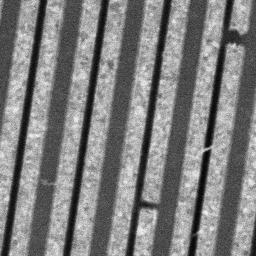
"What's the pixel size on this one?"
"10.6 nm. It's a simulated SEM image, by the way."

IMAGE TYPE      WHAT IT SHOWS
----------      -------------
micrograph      parallel lines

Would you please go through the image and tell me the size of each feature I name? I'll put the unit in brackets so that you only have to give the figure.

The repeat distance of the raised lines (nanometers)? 324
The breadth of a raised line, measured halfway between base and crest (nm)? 192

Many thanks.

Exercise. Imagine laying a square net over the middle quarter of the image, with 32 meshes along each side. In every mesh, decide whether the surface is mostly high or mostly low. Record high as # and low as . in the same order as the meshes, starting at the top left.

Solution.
...####..####.....#####.#####...
..#####..####.....####..#####...
..#####.#####.....####..#####...
..#####.#####.....####..####....
..####..#####.....####..####....
..####..####.....#####..####....
..####..####.....#####..####....
.#####..####.....#####.#####....
.#####..####.....####..#####....
.#####.#####.....####..#####....
.####..#####.....####..####.....
.####..#####.....####..####.....
.####..####.....#####..####.....
.####..####.....#####.#####.....
#####..####.....####..#####....#
#####..####.....####..#####....#
#####.#####.....####..####.....#
####..#####.....####..####.....#
####..#####....#####..####.....#
####..####.....#####..####.....#
####..####.....#####.#####.....#
####..####.....####..####.....##
####.#####.....####..####.....##
###..#####.....####..####.....##
###..#####.....####..####.....##
###..####.....#####..####.....##
###..####.....#####..####.....##
###..####.....#####.#####.....##
###..####.....####..#####.....##
###.#####.....####..####.....###
##..#####.....####..####.....###
##..#####....#####..####.....###